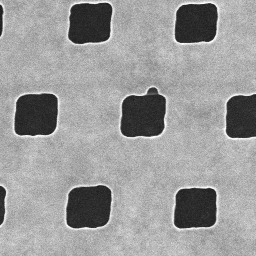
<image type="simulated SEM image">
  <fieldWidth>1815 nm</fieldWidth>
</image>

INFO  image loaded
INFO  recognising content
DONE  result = holes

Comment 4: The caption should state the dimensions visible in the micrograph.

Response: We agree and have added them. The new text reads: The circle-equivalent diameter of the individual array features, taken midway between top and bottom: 324 nanometres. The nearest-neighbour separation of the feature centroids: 753 nanometers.